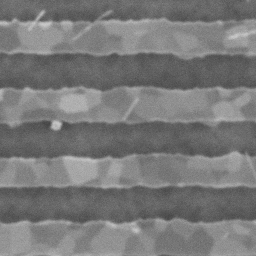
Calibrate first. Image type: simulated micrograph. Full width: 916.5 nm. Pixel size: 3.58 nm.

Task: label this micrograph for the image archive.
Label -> lines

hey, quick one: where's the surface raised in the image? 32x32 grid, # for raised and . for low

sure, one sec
................................
................................
..................###..........#
################################
################################
################################
##.#############################
................................
................................
................................
................................
################################
################################
################################
################################
......##........................
................................
................................
................................
................#########...###.
################################
################################
################################
................................
................................
................................
................................
.................###.##......#..
################################
################################
################################
################################